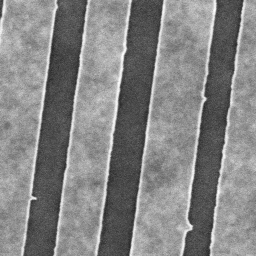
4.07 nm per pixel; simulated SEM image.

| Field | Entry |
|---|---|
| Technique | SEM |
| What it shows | one or a few lines or trenches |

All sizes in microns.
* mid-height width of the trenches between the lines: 0.128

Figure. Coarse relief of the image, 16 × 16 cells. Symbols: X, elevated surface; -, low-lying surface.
XXX--XXX--XXX--X
XXX--XXX--XXX--X
XXX--XXX--XXX--X
XXX--XXX--XXX--X
XXX--XXX--XXX--X
XXX--XX---XXX--X
XXX--XX--XXXX-XX
XXX--XX--XXX--XX
XX--XXX--XXX--XX
XX--XXX--XXX--XX
XX--XXX--XXX--XX
XX--XXX--XXX--XX
XX--XXX--XXX--XX
XX--XX---XXX-XXX
XX--XX--XXXX-XXX
X--XXX--XXX--XXX